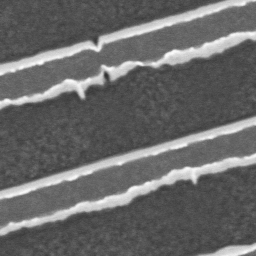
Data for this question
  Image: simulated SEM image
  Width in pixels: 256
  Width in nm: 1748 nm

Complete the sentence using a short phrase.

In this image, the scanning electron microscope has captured one or a few lines or trenches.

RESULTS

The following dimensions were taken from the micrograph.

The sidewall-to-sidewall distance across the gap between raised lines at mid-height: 567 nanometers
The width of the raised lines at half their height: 251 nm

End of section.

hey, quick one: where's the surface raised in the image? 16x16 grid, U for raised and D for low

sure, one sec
DDDDDDDDDDDDDUUU
DDDDDDDDDDUUUUUU
DDDDDDUUUUUUUUUD
DDDUUUUUUUUDDDDD
UUUUUUUDDDDDDDDD
UUUUDDDDDDDDDDDD
DDDDDDDDDDDDDDDD
DDDDDDDDDDDDDDDD
DDDDDDDDDDDDDUUU
DDDDDDDDDUUUUUUU
DDDDDDUUUUUUUUDD
DDUUUUUUUUDDDDDD
UUUUUUUUDDDDDDDD
UUUUDDDDDDDDDDDD
DDDDDDDDDDDDDDDD
DDDDDDDDDDDDDDDU